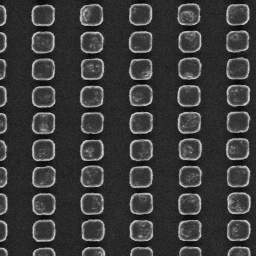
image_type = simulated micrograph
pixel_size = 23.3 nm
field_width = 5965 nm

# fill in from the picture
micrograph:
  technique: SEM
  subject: a regular array of raised bodies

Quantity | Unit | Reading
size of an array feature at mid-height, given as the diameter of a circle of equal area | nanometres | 536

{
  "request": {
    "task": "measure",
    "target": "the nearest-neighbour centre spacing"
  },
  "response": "623 nanometers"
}